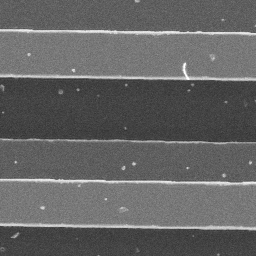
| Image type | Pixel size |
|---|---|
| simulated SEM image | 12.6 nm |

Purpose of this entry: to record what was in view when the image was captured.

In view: lines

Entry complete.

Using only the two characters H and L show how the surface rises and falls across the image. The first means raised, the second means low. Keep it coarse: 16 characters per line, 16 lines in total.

HHHHHHHHHHHHHHHH
HHHHHHHHHHHHHHHH
HHHHHHHHHHHHHHHH
HHHHHHHHHHHHHHHH
HHHHHHHHHHHHHHHH
LLLLLLLLLLLLLLLL
LLLLLLLLLLLLLLLL
LLLLLLLLLLLLLLLL
LLLLLLLLLLLLLLLL
HHHHHHHHHHHHHHHH
HHHHHHHHHHHHHHHH
HHHHHHHHHHHHHHHH
HHHHHHHHHHHHHHHH
HHHHHHHHHHHHHHHH
LLLLLLLLLLLLLLLL
LLLLLLLLLLLLLLLL